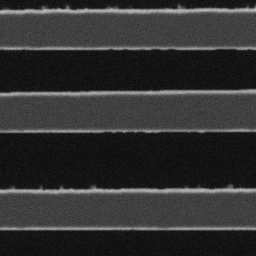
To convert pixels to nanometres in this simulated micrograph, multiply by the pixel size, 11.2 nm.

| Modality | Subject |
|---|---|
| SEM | lines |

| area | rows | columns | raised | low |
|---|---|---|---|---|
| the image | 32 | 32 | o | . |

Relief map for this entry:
................................
oooooooooooooooooooooooooooooooo
oooooooooooooooooooooooooooooooo
oooooooooooooooooooooooooooooooo
oooooooooooooooooooooooooooooooo
oooooooooooooooooooooooooooooooo
................................
................................
................................
................................
................................
..................o.oooooooooooo
oooooooooooooooooooooooooooooooo
oooooooooooooooooooooooooooooooo
oooooooooooooooooooooooooooooooo
oooooooooooooooooooooooooooooooo
ooooooooooooo.ooo.oo.....o......
................................
................................
................................
................................
................................
................................
................................
oooooooooooooooooooooooooooooooo
oooooooooooooooooooooooooooooooo
oooooooooooooooooooooooooooooooo
oooooooooooooooooooooooooooooooo
oooooooooooooooooooooooooooooooo
................................
................................
................................